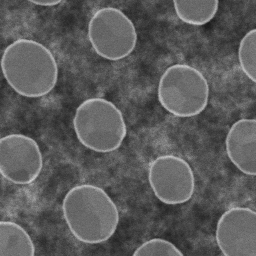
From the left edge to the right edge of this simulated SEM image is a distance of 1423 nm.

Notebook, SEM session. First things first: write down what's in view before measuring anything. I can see raised bodies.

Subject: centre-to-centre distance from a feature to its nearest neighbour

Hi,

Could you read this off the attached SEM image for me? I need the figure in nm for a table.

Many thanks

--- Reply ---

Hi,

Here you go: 496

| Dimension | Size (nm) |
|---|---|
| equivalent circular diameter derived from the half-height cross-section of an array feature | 278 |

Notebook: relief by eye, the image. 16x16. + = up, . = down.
...........++...
......++........
......++.......+
+++...++.......+
++++......++...+
.++.......+++...
.....++...+++...
.....+++........
.....+++......++
++............++
++.......+++...+
.........+++....
....+++...++....
....+++.......++
++...++.......++
++.......++...++